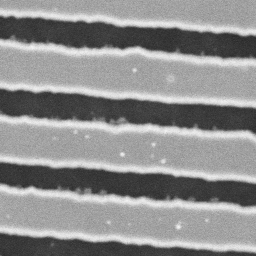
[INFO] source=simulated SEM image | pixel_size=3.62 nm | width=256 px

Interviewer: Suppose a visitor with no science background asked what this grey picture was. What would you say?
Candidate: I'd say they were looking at lines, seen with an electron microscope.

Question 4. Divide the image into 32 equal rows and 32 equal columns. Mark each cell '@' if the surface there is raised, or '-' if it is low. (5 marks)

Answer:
@@@@@@@@@@@@@@@@@@@@@@@@@@@@@@@@
@@@@@@@@@@@@@@@@@@@@@@@@@@@@@@@@
-------@@@@@@@@@@@@@@@@@@@@@@@@@
----------------------@@@@@@@@@@
--------------------------------
@@@@@@@-------------------------
@@@@@@@@@@@@@@@@@@@@------------
@@@@@@@@@@@@@@@@@@@@@@@@@@@@@@@@
@@@@@@@@@@@@@@@@@@@@@@@@@@@@@@@@
@@@@@@@@@@@@@@@@@@@@@@@@@@@@@@@@
@@@@@@@@@@@@@@@@@@@@@@@@@@@@@@@@
----@-@@@@@@@@@@@@@@@@@@@@@@@@@@
------------------@@@@@@@@@@@@@@
--------------------------------
@-------------------------------
@@@@@@@@@@@@@-------------------
@@@@@@@@@@@@@@@@@@@@@@@@@@@@@@@-
@@@@@@@@@@@@@@@@@@@@@@@@@@@@@@@@
@@@@@@@@@@@@@@@@@@@@@@@@@@@@@@@@
@@@@@@@@@@@@@@@@@@@@@@@@@@@@@@@@
--@@@@@@@@@@@@@@@@@@@@@@@@@@@@@@
---------------@@@@@@@@@@@@@@@@@
--------------------------@@@@@@
@@------------------------------
@@@@@@@@@@@@@@@-----------------
@@@@@@@@@@@@@@@@@@@@@@@@@@@@@---
@@@@@@@@@@@@@@@@@@@@@@@@@@@@@@@@
@@@@@@@@@@@@@@@@@@@@@@@@@@@@@@@@
@@@@@@@@@@@@@@@@@@@@@@@@@@@@@@@@
---@@@@@@@@@@@@@@@@@@@@@@@@@@@@@
-----------------@@@@@@@@@@@@@@@
-------------------------------@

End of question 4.